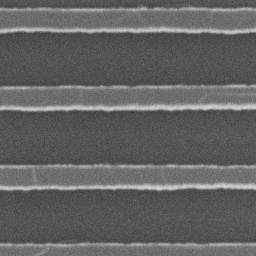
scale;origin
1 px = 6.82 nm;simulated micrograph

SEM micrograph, lines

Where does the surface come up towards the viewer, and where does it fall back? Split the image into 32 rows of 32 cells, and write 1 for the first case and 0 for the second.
00000000000000000000000000000000
11111111111111111111111111111111
11111111111111111111111111111111
11111111111111111111111111111111
00000000000000000000000000000000
00000000000000000000000000000000
00000000000000000000000000000000
00000000000000000000000000000000
00000000000000000000000000000000
00000000000000000000000000000000
00000000000000000000000000000000
11111111111111111111111111111111
11111111111111111111111111111111
11111111111111111111111111111111
00000000000000000000000000000000
00000000000000000000000000000000
00000000000000000000000000000000
00000000000000000000000000000000
00000000000000000000000000000000
00000000000000000000000000000000
00000000000000000000000000000000
11111111111111111111111111111111
11111111111111111111111111111111
11111111111111101111111101100111
00000000000000000000000000000000
00000000000000000000000000000000
00000000000000000000000000000000
00000000000000000000000000000000
00000000000000000000000000000000
00000000000000000000000000000000
00000000000000000000000000000000
11111111111111111111111111111111